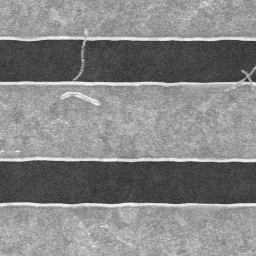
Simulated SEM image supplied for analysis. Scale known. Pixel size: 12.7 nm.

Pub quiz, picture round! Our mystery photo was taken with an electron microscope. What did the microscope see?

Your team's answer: wiring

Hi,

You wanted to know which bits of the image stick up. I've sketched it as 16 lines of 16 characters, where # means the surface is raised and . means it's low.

################
################
................
................
................
################
################
################
################
################
................
................
................
################
################
################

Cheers